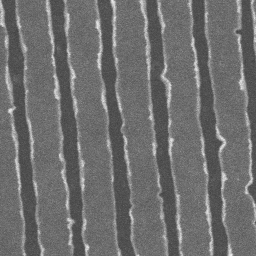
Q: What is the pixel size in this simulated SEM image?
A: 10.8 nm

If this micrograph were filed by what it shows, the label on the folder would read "parallel lines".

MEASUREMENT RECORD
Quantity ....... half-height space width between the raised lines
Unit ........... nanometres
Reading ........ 148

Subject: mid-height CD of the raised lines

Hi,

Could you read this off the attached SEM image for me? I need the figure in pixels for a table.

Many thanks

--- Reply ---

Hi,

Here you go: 33.1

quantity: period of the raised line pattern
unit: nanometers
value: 501